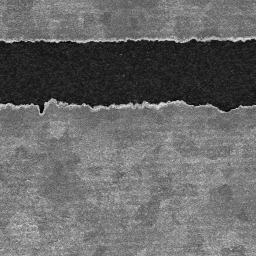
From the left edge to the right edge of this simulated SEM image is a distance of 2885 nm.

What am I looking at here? one or a few lines or trenches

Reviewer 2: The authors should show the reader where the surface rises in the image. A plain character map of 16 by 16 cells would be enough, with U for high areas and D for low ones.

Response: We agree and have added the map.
UUUUUUUUUUUUUUUU
UUUUUUUUUUUUUUUU
UUUUUUUUDDDUDDDD
DDDDDDDDDDDDDDDD
DDDDDDDDDDDDDDDD
DDDDDDDDDDDDDDDD
DDDUDDDDDDUUDDDD
UUUUUUUUUUUUUUUU
UUUUUUUUUUUUUUUU
UUUUUUUUUUUUUUUU
UUUUUUUUUUUUUUUU
UUUUUUUUUUUUUUUU
UUUUUUUUUUUUUUUU
UUUUUUUUUUUUUUUU
UUUUUUUUUUUUUUUU
UUUUUUUUUUUUUUUU